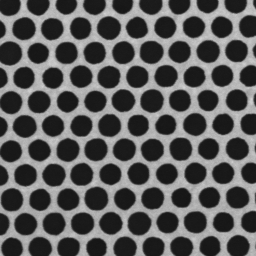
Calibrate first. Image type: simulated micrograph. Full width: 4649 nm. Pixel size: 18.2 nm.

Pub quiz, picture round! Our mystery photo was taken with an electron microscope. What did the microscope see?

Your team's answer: a regular array of holes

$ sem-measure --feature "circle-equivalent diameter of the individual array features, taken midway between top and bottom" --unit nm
408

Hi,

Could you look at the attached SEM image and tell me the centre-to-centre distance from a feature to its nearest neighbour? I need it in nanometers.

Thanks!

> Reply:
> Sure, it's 506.